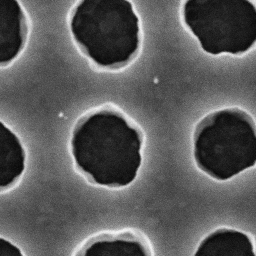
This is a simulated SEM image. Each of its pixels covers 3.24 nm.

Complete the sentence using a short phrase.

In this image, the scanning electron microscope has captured holes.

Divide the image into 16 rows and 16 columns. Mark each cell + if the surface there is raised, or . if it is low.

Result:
.++++...++++....
..++.....+++....
..+++....+++....
.+++++..++++++++
++++++++++++++++
++++++++++++++++
++++++++++++++++
+++++...+++++...
.++++....+++....
..+++....+++....
.++++....++++..+
.+++++..++++++++
++++++++++++++++
++++++++++++++++
+++++++++++++..+
.++++....+++....